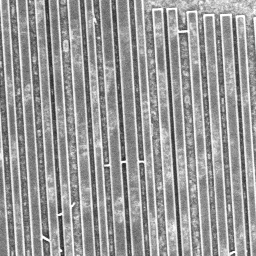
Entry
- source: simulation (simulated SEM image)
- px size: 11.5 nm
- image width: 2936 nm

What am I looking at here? parallel lines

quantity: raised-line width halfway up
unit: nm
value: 109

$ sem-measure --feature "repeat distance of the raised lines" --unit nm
193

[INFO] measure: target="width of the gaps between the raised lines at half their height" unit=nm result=78.7